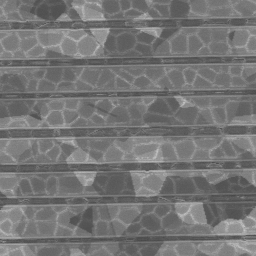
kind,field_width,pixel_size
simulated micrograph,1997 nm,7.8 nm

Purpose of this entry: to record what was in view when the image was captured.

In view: parallel lines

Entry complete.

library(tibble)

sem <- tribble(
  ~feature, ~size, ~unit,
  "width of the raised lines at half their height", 199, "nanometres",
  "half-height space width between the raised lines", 66.3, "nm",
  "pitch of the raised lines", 35.4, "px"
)